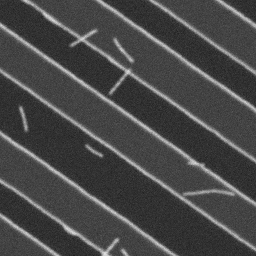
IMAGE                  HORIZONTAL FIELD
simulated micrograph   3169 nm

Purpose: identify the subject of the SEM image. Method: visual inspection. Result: lines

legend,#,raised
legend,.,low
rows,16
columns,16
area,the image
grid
..#####...####..
....####....####
#....#####...###
###....####...##
####....#####...
.#####...#####..
...####....#####
....#####...####
......####....##
##.....####....#
###......####...
#####.....####..
..####.....#####
...#####.....###
##...####.....##
###...####......